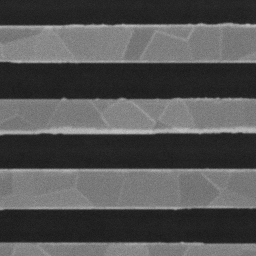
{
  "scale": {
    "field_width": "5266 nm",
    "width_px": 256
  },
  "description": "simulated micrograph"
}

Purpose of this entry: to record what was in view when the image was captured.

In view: lines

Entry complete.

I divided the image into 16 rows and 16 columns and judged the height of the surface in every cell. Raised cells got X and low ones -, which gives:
----------------
----------------
XXXXXXXXXXXXXXXX
XXXXXXXXXXXXXXXX
----------------
----------------
XXXXXXXXXXXXXXXX
XXXXXXXXXXXXXXXX
----------------
----------------
----------------
XXXXXXXXXXXXXXXX
XXXXXXXXXXXXXXXX
----------------
----------------
XXXXXXXXXXXXXXXX